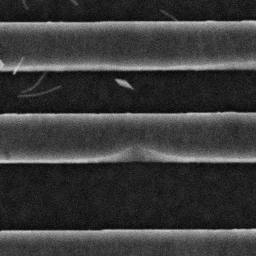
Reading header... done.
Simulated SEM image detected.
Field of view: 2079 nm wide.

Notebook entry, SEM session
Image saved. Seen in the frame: lines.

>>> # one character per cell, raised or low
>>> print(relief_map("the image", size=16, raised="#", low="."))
................
################
################
################
................
................
................
################
################
################
................
................
................
................
################
################